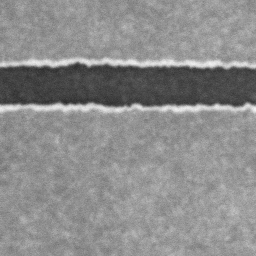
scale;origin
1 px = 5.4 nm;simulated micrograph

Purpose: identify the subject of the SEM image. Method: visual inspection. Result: one or a few lines or trenches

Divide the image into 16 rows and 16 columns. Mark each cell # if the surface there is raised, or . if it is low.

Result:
################
################
################
################
................
................
................
################
################
################
################
################
################
################
################
################